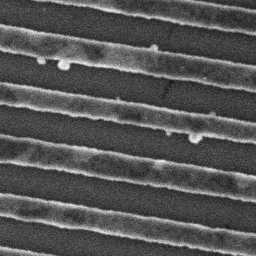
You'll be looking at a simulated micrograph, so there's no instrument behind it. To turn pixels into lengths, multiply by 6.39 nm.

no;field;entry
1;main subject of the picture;lines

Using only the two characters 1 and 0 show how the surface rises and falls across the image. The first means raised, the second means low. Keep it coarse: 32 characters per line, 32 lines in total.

00000000111111111111111111100000
00000000000000111111111111111111
00000000000000000000011111111111
11000000000000000000000000111111
11111111000000000000000000000000
11111111111111000000000000000000
01111111111111111111100000000000
00000101111111111111111111100000
00000000000000111111111111111111
00000000000000000001111111111111
10000000000000000000000000111111
11111110000000000000000000000000
11111111111111000000000000000000
00001111111111111111000000000000
00000000011111111111111111100000
00000000000000001111111111111111
00000000000000000000001111111111
11111000000000000000000010000111
11111111111000000000000000000000
11111111111111110000000000000000
00111111111111111111111000000000
00000000011111111111111111110000
00000000000000111111111111111111
00000000000000000000011111111111
11000000000000000000000000011111
11111111000000000000000000000000
11111111111111000000000000000000
00111111111111111111100000000000
00000000111111111111111111000000
00000000000000011111111111111111
00000000000000000000011111111111
11110000000000000000000000011111